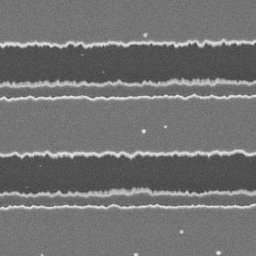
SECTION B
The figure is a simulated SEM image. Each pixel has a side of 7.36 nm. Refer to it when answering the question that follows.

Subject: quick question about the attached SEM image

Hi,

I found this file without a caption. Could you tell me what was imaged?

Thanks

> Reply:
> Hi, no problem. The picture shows lines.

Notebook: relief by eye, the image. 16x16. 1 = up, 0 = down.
1111111111111111
1111111111111111
1111111111111111
0000000000000000
0000000000000000
1111111111111111
1111111111111111
1111111111111111
1111111111111111
1111111111111111
0000000000000000
0000000000000000
1111111111111111
1111111111111111
1111111111111111
1111111111111111